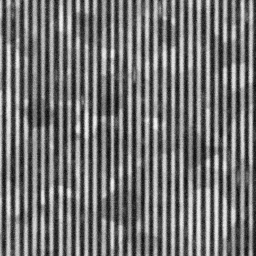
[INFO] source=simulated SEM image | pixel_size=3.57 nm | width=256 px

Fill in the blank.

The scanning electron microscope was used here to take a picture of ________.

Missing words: parallel lines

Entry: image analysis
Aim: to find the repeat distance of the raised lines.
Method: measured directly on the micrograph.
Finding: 30.9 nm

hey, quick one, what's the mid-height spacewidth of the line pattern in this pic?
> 0.0183 micrometres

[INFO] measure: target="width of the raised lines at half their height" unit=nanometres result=12